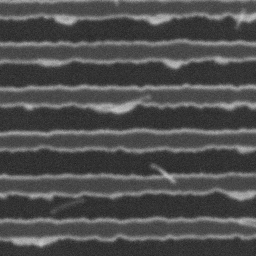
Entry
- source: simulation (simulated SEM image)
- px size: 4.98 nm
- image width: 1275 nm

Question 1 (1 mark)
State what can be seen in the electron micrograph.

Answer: lines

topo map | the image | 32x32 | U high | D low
UUUUUUUUUUUUUUUUUUUUUUUUUUUUUUUU
UUUUUUUUUUUUUUUUUUUUUUUUUUUUUUUU
DDDDDDDDDDDDDDDDDDDDDDDDDDDDDDDD
DDDDDDDDDDDDDDDDDDDDDDDDDDDDDDDD
DDDDDDDDDDDDDDDDDDDDDDDDDDDDDDDD
UUUUUUUUUUUUUUUUUUUUUUUUUUUUUUUU
UUUUUUUUUUUUUUUUUUUUUUUUUUUUUUUU
UUUUUUUUUUUUUUUUUUUUUUUUUUDDUUUU
DDDDDDDDDDDDDDDDDDDDDDDDDDDDDDDD
DDDDDDDDDDDDDDDDDDDDDDDDDDDDDDDD
DDDDDDDDDDDDDDDDDDDDDDDDDDDDDDDD
UUUUUUUUUUUUUUUUUUUUUUUUUUUUUUUU
UUUUUUUUUUUUUUUUUUUUUUUUUUUUUUUU
DDDDDDDDDDDDDDDDDDDDDDDDDDDDDDDD
DDDDDDDDDDDDDDDDDDDDDDDDDDDDDDDD
DDDDDDDDDDDDDDDDDDDDDDDDDDDDDDDD
DDDDDDDUUDUDUUUUUUUUUUUUUUDUUUUU
UUUUUUUUUUUUUUUUUUUUUUUUUUUUUUUU
UUUUUDUUUUUUUUUUUUUUUUUUUUDUUDUU
DDDDDDDDDDDDDDDDDDDDDDDDDDDDDDDD
DDDDDDDDDDDDDDDDDDDDDDDDDDDDDDDD
DDDDDDDDDDDDDDDDDDDDDDDDDDDDDDDD
UUUUUUUUUUUUUUUUUUUUUUUUUUUUUUUU
UUUUUUUUUUUUUUUUUUUUUUUUUUUUUUUU
DDDDDDDDDUDDDUDDDDDDDDDDDDDDDDDD
DDDDDDDDDDDDDDDDDDDDDDDDDDDDDDDD
DDDDDDDDDDDDDDDDDDDDDDDDDDDDDDDD
UUDDUUUDUUUDUUDDUUUUUUUUUUUUUUUU
UUUUUUUUUUUUUUUUUUUUUUUUUUUUUUUU
UUUUUUUUUUUUUUUUUUUUUUUUUUUUUUUU
DDDDDDDDDDDDDDDDDDDDDDDDDDDDDDDD
DDDDDDDDDDDDDDDDDDDDDDDDDDDDDDDD